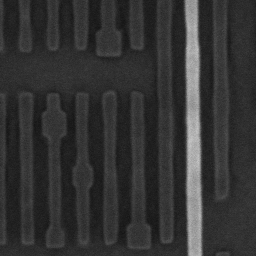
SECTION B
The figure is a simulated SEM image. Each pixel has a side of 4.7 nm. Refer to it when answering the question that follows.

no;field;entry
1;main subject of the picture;wiring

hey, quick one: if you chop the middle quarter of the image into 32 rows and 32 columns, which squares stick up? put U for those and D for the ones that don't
DDDDDDDDDDDDDDDDDDDDDDDDUUUDDDDU
DDDDDDDDDDDDDDDDDDDDDDDDUUUDDDDU
DDDDDDDDDDDDDDDDDDDDDDDUUUUDDDDU
DDDDDDDDDDDDDDDDDDDDDDDUUUUDDDDU
DDDDDDDDDDDDDDDDDDDDDDDUUUUDDDDU
DDDDDDDDDDDDDDDDDDDDDDDUUUUDDDDU
DDDDDDDDDDDDDDDDDDDDDDDUUUUDDDDU
DDDUUUDDDDUUUDDDDUUDDDDDUUUDDDDU
DDDUUUDDDDUUUDDDDUUUDDDDUUUDDDDU
DDDUUUDDDDUUUDDDDUUUDDDDUUUDDDDU
DDDUUUDDDDUUUDDDDUUUDDDDUUUDDDDU
DDDUUUDDDDUUUDDDDUUUDDDDUUUDDDDU
DDDUUUDDDDUUUDDDDUUUDDDDUUUDDDDU
DDDUUUDDDDUUUDDDDUUUDDDDUUUDDDDU
DDDUUUDDDDUUUDDDDUUUDDDDUUUDDDDU
DDDUUUDDDDUUUDDDDUUUDDDDUUUDDDDU
DDDUUUDDDDUUUDDDDUUUDDDDUUUDDDDU
DDDUUUDDDDUUUDDDDUUUDDDDUUUDDDDU
DDDUUUDDDDUUUDDDDUUUDDDDUUUDDDDU
DDDUUUDDDDUUUDDDDUUUDDDDUUUDDDDU
DDDUUUDDDDUUUDDDDUUUDDDDUUUDDDDU
DDDUUUDDDDUUUDDDDUUUDDDDUUUDDDDU
DDDUUUDDDDUUUDDDDUUUDDDDUUUDDDDU
DDDUUUDDDDUUUDDDDUUUDDDDUUUDDDDU
DDDUUUDDDDUUUDDDDUUUDDDDUUUDDDDU
DDDUUUDDDDUUUDDDDUUUDDDDUUUDDDDU
DDUUUUUDDDUUUDDDDUUUDDDDUUUDDDDU
DDUUUUUDDDUUUDDDDUUUDDDDUUUDDDDU
DDUUUUUDDDUUUDDDDUUUDDDDUUUDDDDU
DDUUUUUDDDUUUDDDDUUUDDDDUUUDDDDU
DDDUUUUDDDUUUDDDDUUUDDDDUUUDDDDU
DDDUUUDDDDUUUDDDDUUUDDDDUUUDDDDU